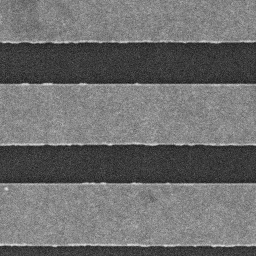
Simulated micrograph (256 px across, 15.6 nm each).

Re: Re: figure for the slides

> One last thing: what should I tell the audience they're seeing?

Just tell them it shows lines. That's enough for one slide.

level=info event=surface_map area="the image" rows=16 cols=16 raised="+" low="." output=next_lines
++++++++++++++++
++++++++++++++++
++++++++++++++++
................
................
++++++++++++++++
++++++++++++++++
++++++++++++++++
++++++++++++++++
................
................
.....++.+.......
++++++++++++++++
++++++++++++++++
++++++++++++++++
................